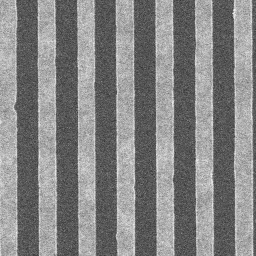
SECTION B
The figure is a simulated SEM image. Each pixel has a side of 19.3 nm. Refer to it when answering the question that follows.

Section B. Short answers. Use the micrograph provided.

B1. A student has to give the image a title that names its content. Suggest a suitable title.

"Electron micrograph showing parallel lines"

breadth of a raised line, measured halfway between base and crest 324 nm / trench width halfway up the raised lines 430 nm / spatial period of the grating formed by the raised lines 759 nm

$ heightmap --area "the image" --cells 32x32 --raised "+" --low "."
++...++...++...++...++..++...++.
++...++...++...++..+++..++...++.
++...++...++...++...++..++...++.
++...++...++...++..+++..+++..++.
++...++...++...++..+++...+...++.
++...++...++...++..+++...+...++.
++...++...++...++...++..+++..++.
++...++...++...++...++..++...++.
++...++...++...++...++..+++..++.
++...++...++...++...++..+++..++.
++...++...++...++...++..++...++.
++...++...++...++...++..++...+++
++...++...++...++...++...+...++.
++...++...++...++...++...+...++.
++...++...++...++...++...+...++.
++...++...++...++...++...+...++.
++...++...++...++...++...+...++.
++...++...++...++...++...++..++.
++...++...++...++...++...++..++.
++...++...++...++...++...++..++.
++...++...++...++...++...++..++.
++...++...++...++...++...+...++.
++...++...++...++...++...+...++.
++...++...++...++...++...++..++.
++...++...++...++...++...++..+++
++...++...++...++...++...++..+++
++...++...++...++...++...++..+++
++...++...++...++...++...++..+++
++...++...++...++...++...++..+++
++...++...++...++...++...++..+++
++...++...++...++...++...++..+++
++...++...++...++...++...++...++